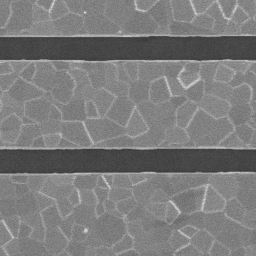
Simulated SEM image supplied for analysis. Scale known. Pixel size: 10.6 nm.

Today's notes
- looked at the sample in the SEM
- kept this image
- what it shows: lines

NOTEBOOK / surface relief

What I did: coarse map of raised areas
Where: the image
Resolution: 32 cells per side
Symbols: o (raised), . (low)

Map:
oooooooooooooooooooooooooooooooo
oooooooooooooooooooooooooooooooo
oooooooooooooooooooooooooooooooo
oooooooooooooooooooooooooooooooo
ooooooooooooooooooo..ooo.ooo....
................................
................................
.....o......................o...
oooooooooooooooooooooooooooooooo
oooooooooooooooooooooooooooooooo
oooooooooooooooooooooooooooooooo
oooooooooooooooooooooooooooooooo
oooooooooooooooooooooooooooooooo
oooooooooooooooooooooooooooooooo
oooooooooooooooooooooooooooooooo
oooooooooooooooooooooooooooooooo
oooooooooooooooooooooooooooooooo
oooooooooooooooooooooooooooooooo
oooooooooooooooooooooooooooooooo
................................
................................
................................
oooooooooooooooooooooooooooooooo
oooooooooooooooooooooooooooooooo
oooooooooooooooooooooooooooooooo
oooooooooooooooooooooooooooooooo
oooooooooooooooooooooooooooooooo
oooooooooooooooooooooooooooooooo
oooooooooooooooooooooooooooooooo
oooooooooooooooooooooooooooooooo
oooooooooooooooooooooooooooooooo
oooooooooooooooooooooooooooooooo